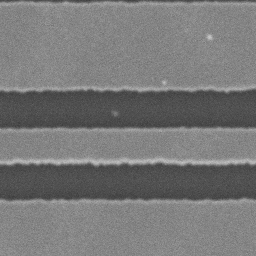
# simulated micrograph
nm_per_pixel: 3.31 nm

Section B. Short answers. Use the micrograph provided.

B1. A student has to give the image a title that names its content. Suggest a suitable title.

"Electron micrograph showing lines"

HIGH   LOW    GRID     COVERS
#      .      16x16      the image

################
################
################
################
################
################
................
................
################
################
................
................
...............#
################
################
################